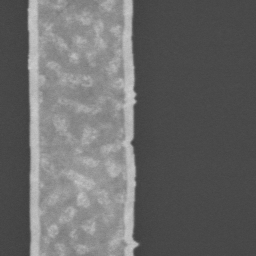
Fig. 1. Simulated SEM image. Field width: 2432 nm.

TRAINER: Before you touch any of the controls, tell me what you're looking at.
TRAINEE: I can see one or a few lines or trenches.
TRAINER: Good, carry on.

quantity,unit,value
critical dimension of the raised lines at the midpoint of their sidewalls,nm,908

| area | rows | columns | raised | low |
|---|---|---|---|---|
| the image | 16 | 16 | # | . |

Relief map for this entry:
..######........
..######........
..######........
..######........
..######........
..######........
..######........
..######........
..######........
..######........
..######........
..######........
..######........
..######........
..######........
..######........